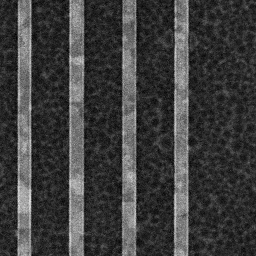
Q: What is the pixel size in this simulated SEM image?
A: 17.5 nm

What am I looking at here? parallel lines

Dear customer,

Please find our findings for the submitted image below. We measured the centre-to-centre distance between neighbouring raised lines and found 915 nanometers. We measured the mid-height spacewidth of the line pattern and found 40 pixels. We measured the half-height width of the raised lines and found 219 nm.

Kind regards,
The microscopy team